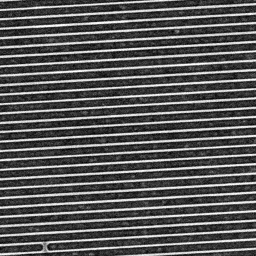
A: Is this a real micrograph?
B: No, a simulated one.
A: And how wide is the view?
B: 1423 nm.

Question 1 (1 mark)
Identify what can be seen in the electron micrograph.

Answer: parallel lines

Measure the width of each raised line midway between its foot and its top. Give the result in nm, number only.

7.6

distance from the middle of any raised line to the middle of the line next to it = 52.2 nanometers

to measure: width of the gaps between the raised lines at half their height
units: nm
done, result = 42.3